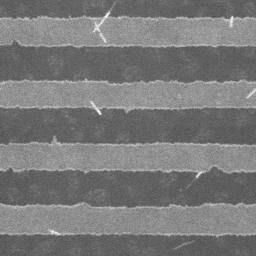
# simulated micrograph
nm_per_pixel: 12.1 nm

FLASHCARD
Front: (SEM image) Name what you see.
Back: one or a few lines or trenches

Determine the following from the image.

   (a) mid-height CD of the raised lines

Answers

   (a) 329 nm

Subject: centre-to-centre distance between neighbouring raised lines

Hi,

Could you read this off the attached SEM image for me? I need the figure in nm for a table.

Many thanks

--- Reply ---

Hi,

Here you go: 761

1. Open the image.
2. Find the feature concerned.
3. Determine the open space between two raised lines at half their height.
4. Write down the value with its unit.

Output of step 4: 35.5 pixels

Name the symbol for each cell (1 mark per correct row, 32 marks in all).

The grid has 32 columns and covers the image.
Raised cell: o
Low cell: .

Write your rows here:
...........o....................
................................
oooooooooooooooooooooooooooooooo
oooooooooooooooooooooooooooooooo
oooooooooooooooooooooooooooooooo
o..ooooooooooooooooooooooooooooo
................................
................................
................................
................................
oooooooooooooooooooooooooooooooo
oooooooooooooooooooooooooooooooo
oooooooooooooooooooooooooooooooo
...........oo..oooooooo......o..
.o..............................
................................
................................
................................
oooooooooooooooooooooooooooooooo
oooooooooooooooooooooooooooooooo
oooooooooooooooooooooooooooooooo
........................oo..oo..
.....................o..........
................................
................................
..........o................o....
oooooooooooooooooooooooooooooooo
oooooooooooooooooooooooooooooooo
oooooooooooooooooooooooooooooooo
................................
................o...............
..................o.............